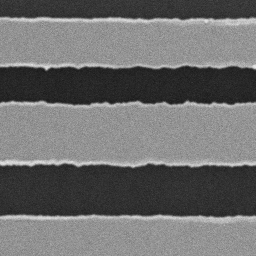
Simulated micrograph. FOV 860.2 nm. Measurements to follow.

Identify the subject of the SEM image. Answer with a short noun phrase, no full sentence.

lines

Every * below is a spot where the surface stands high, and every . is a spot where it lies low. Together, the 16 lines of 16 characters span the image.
................
****************
****************
****************
................
................
****..********.*
****************
****************
****************
................
................
................
***..******.....
****************
****************